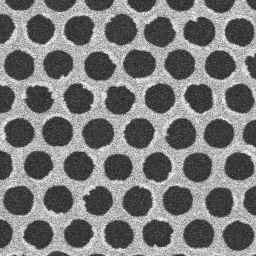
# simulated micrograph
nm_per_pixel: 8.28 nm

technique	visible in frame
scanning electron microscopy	a regular array of holes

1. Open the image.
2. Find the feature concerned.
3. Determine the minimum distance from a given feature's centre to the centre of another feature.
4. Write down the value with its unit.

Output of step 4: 317 nanometers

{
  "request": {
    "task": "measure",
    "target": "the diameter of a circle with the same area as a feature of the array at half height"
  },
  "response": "246 nanometers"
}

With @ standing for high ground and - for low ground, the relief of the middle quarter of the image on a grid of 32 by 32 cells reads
--@@@--------@@--------@@-------
--@@@--------@@--------@@@------
-@@@@@------@@@@------@@@@------
@@@@@@@----@@@@@@---@@@@@@@----@
@@@@@@@@@@@@@@@@@@@@@@@@@@@@@@@@
@----@@@@@@@-@-@@@@@@@----@@@@@-
@-----@@@@@-----@@@@@------@@@--
-------@@@@------@@@--------@@--
--------@@--------@@--------@@--
-------@@@--------@@--------@@@-
@------@@@-------@@@@------@@@@-
@-----@@@@@-----@@@@@@----@@@@@@
@@@-@@@@@@@@---@@@@@@@@@@@@@@@@@
@@@@@@@@@@@@@@@@@@@@@@@@@@@@@-@@
-@@@@@-----@@@@@@----@@@@@@-----
--@@@-------@@@-------@@@@------
--@@@-------@@@--------@@@------
--@@---------@@--------@@@------
--@@@-------@@@-------@@@-------
-@@@@-------@@@@------@@@@------
@@@@@@----@@@@@@@----@@@@@------
@@@@@@@@@@@@@@@@@@@@@@@@@@@@@@@@
@@----@@@@@@@-@@@@@@@@---@@@@@@@
@------@@@@-----@@@@------@@@@@-
-------@@@-------@@@-------@@@--
--------@@-------@@@-------@@@--
-------@@@-------@@@-------@@@--
@------@@@-------@@@------@@@@--
@-----@@@@@-----@@@@@-----@@@@@-
@@@@@@@@@@@@@@@@@@@@@@@-@@@@@@@@
@@@@@@@@@@@@@@@@@@@@@@@@@@@-@@@@
-@@@@@@----@@@@@-----@@@@@-----@